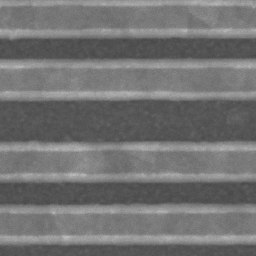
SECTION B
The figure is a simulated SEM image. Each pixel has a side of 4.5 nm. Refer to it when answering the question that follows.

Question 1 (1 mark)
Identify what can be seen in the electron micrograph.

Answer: one or a few lines or trenches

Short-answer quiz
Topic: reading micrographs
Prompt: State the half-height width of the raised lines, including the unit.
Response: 0.136 µm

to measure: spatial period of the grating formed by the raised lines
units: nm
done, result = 311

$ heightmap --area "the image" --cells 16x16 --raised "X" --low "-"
XXXXXXXXXXXXXXXX
XXXXXXXXXXXXXXXX
----------------
----------------
XXXXXXXXXXXXXXXX
XXXXXXXXXXXXXXXX
----------------
----------------
----------------
XXXXXXXXXXXXXXXX
XXXXXXXXXXXXXXXX
----------------
----------------
XXXXXXXXXXXXXXXX
XXXXXXXXXXXXXXXX
----------------